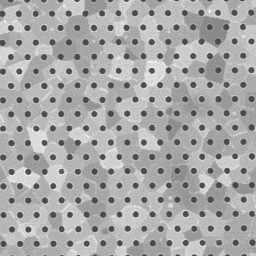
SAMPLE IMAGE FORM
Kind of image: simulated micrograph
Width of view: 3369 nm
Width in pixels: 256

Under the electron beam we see a regular array of holes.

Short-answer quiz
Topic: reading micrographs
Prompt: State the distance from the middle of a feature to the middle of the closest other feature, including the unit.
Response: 16.3 px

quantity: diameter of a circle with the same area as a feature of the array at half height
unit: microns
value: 0.084